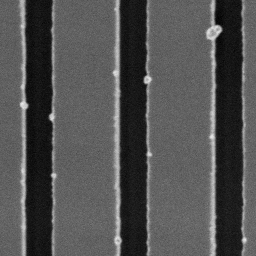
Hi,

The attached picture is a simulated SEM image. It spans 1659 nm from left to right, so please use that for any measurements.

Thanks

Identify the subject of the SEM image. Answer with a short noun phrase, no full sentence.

lines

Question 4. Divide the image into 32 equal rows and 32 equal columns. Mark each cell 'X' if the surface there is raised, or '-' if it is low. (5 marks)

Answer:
XXX----XXXXXXXX---XXXXXXXXX---XX
XXX----XXXXXXXX---XXXXXXXXX---XX
XXX----XXXXXXXX---XXXXXXXXX---XX
XXX----XXXXXXXX---XXXXXXXXXX--XX
XXX----XXXXXXXX---XXXXXXXXX---XX
XXX----XXXXXXXX---XXXXXXXXX---XX
XXX----XXXXXXXX---XXXXXXXXX---XX
XXX----XXXXXXXX---XXXXXXXXX---XX
XXX----XXXXXXXX---XXXXXXXXX---XX
XXX----XXXXXXXX---XXXXXXXXX---XX
XXX----XXXXXXXX---XXXXXXXXX---XX
XXX----XXXXXXXX---XXXXXXXXX---XX
XXX----XXXXXXXX---XXXXXXXXX---XX
XXX----XXXXXXXX---XXXXXXXXX---XX
XXX---XXXXXXXXX---XXXXXXXXX---XX
XXX----XXXXXXXX---XXXXXXXXX---XX
XXX----XXXXXXXX---XXXXXXXXX---XX
XXX----XXXXXXXX---XXXXXXXXX---XX
XXX----XXXXXXXX----XXXXXXXX---XX
XXX----XXXXXXXX---XXXXXXXXX---XX
XXX----XXXXXXXX---XXXXXXXXX---XX
XXX----XXXXXXXX---XXXXXXXXX---XX
XXX----XXXXXXXX----XXXXXXXX---XX
XXX----XXXXXXXX---XXXXXXXXX---XX
XXX----XXXXXXXX---XXXXXXXXX---XX
XXX----XXXXXXXX---XXXXXXXXX---XX
XXX----XXXXXXXX---XXXXXXXXX---XX
XXX----XXXXXXXX---XXXXXXXXX---XX
XXX----XXXXXXXX---XXXXXXXXX---XX
XXX----XXXXXXXX----XXXXXXXX---XX
XXX----XXXXXXXX---XXXXXXXXX---XX
XXX----XXXXXXXX---XXXXXXXXX---XX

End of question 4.